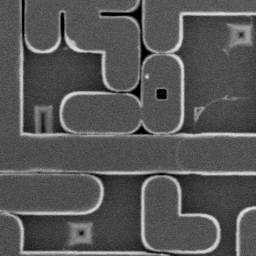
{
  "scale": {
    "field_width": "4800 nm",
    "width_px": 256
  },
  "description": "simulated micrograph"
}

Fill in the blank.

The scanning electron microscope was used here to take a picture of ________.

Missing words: wiring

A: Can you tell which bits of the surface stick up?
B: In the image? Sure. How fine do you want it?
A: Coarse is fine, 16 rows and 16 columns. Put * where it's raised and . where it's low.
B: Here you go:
****************
***********.....
***********.....
*.....*****.....
*......****.....
*......****.....
*...*******.....
*...*******.....
****************
****************
****************
******...**.....
******...**.....
*........****..*
*........*****.*
**.......****..*